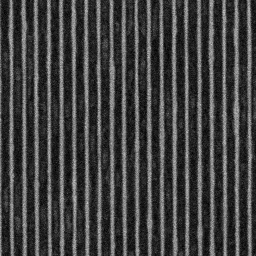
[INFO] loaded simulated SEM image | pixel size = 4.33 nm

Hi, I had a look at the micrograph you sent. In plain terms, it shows parallel lines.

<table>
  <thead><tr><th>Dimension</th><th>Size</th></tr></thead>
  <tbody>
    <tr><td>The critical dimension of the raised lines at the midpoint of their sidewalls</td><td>15.2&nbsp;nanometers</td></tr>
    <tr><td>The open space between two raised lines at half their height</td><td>41.2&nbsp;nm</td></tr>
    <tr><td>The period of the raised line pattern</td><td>54.2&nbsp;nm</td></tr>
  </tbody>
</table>